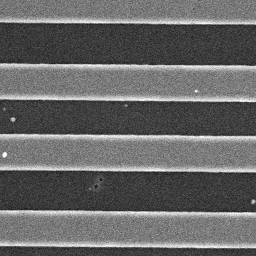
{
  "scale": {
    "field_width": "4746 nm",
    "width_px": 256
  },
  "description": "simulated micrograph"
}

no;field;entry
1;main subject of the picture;lines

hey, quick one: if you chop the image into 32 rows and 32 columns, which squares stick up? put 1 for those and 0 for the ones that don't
11111111111111111111111111111111
11111111111111111111111111111111
11111111111111111111111111111111
00000000000000000000000000000000
00000000000000000000000000000000
00000000000000000000000000000000
00000000000000000000000000000000
00000000000000000000000000000000
11111111111111111111111111111111
11111111111111111111111111111111
11111111111111111111111111111111
11111111111111111111111111111111
00000000000000000111111111111111
00000000000000000000000000000000
00000000000000000000000000000000
00000000000000000000000000000000
00000000000000000000000000000000
11111111111111111111111111111111
11111111111111111111111111111111
11111111111111111111111111111111
11111111111111111111111111111111
00000000000000000000000000000000
00000000000000000000000000000000
00000000000000000000000000000000
00000000000000000000000000000000
00000000000000000000000000000000
11111000000000000000000000000000
11111111111111111111111111111111
11111111111111111111111111111111
11111111111111111111111111111111
11111111111111111111111111111111
00000000000000000000000000000000